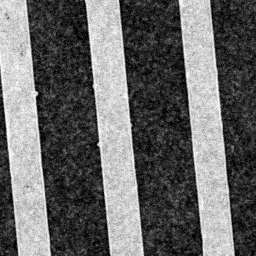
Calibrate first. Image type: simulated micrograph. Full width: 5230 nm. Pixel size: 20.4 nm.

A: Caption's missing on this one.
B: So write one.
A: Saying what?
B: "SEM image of one or a few lines or trenches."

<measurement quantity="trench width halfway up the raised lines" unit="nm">1250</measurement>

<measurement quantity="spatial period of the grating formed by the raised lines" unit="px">91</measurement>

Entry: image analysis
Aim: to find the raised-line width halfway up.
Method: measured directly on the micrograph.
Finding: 602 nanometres